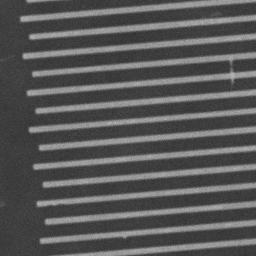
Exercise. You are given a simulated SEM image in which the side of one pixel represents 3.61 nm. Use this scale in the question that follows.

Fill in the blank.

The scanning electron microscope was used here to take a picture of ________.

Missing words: parallel lines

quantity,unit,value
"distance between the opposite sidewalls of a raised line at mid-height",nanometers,16.6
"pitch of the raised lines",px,18.6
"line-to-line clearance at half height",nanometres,49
